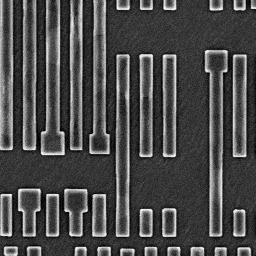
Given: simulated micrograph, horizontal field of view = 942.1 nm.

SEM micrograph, wiring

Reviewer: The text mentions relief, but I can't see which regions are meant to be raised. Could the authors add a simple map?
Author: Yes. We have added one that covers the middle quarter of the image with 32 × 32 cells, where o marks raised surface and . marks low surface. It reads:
..oo...ooo...ooo...ooo...ooo....
..oo...ooo...ooo...ooo...ooo....
..oo...ooo...ooo...ooo...ooo....
..oo...ooo...ooo...ooo...ooo....
..oo...ooo...ooo...ooo...ooo....
..oo...ooo...ooo...ooo...ooo....
..oo...ooo...ooo...ooo...ooo....
..oo...ooo...ooo...ooo...ooo....
..oo...ooo...ooo...ooo...ooo....
..oo...ooo...ooo...ooo...ooo....
..oo...ooo...ooo...ooo...ooo....
..oo...ooo...ooo...ooo...ooo....
..oo...ooo...ooo...ooo...ooo....
..oo...ooo...ooo...ooo...ooo....
..oo...ooo...ooo...ooo...ooo....
..oo...ooo...ooo...ooo...ooo....
..oo...ooo...ooo...ooo...ooo....
..oo...oooo..ooo...ooo...ooo....
..oo...oooo..ooo...ooo...ooo....
..oo...oooo..ooo...ooo...ooo....
..oo...oooo..ooo...ooo...ooo....
.......oooo..ooo...ooo...ooo....
.............ooo...ooo...ooo....
.............ooo................
.............ooo................
.............ooo................
.............ooo................
.............ooo................
.............ooo................
.............ooo................
.............ooo................
.............ooo................